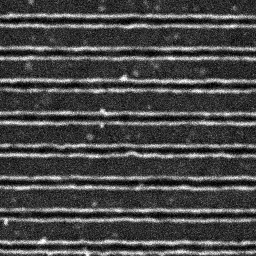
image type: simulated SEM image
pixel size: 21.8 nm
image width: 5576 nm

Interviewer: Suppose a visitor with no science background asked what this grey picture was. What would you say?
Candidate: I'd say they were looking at parallel lines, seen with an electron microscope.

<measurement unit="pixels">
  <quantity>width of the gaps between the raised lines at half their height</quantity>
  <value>21.6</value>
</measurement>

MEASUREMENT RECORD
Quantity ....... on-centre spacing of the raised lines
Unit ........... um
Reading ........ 0.705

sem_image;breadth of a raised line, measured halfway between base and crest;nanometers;237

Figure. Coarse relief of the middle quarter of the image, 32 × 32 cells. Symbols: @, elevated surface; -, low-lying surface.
--------------------------------
--------------------------------
--------------------------------
--------------------------------
@@@@@@@@@@@@@@@@@@@@@@@@@@@@@@@@
@@@@@@@@@@@@@@@@@@@@@@@@@@@@@@@@
@@@@@@@@@@@@@@@--@@@@@@@@@@@@@@@
--------------------------------
--------------------------------
--------------------------------
--------------------------------
--------------------------------
@@@@@@@@@@@@@@@@@@@@@@@@@@@@@@@@
@@@@@@@@@@@@@@@@@@@@@@@@@@@@@@@@
@@@@@@@@@@@@@@@@@@@@@@@@@@@@@@@@
--------------------------------
--------------------------------
--------------------------------
--------------------------------
--------------------------------
@@@@@@@@-----@@@@-----@-@@@-@@@@
@@@@@@@@@@@@@@@@@@@@@@@@@@@@@@@@
@@@@@@@@@@@@@@@@-@@@@@@@@@@@@@@@
--------------------------------
--------------------------------
--------------------------------
--------------------------------
--------------------------------
@@@@@@@@@@@@@@@@@@@@@@@@@@@@@@--
@@@@@@@@@@@@@@@@@@@@@@@@@@@@@@@@
@@@@@@@@@@@@@@@@@@@@@@@@@@@@@@@@
--------------------------------